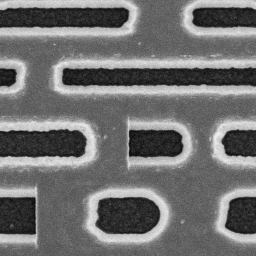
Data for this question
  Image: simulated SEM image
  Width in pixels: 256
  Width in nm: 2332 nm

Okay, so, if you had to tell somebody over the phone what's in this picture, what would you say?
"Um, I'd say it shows one or a few lines or trenches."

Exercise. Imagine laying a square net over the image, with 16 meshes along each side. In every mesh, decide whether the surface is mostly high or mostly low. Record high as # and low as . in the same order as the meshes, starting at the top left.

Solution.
........####....
........####....
################
################
.###............
.###............
################
################
......##....##..
......##...###..
################
################
..####....####..
..####....####..
..####....####..
################